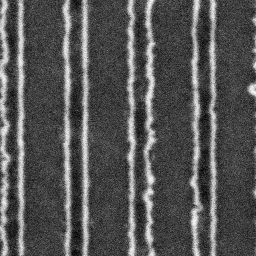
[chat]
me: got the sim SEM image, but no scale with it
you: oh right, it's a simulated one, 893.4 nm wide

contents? one or a few lines or trenches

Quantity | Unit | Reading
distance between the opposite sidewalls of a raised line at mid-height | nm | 65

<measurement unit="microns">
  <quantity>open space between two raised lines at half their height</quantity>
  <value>0.158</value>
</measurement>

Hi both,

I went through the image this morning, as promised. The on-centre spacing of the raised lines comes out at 224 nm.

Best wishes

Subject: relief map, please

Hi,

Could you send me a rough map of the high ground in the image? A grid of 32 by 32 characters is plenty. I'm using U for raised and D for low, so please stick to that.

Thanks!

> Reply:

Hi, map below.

UUUDDDDDUUUDDDDDUUUDDDDDDUUDDDDD
UUUDDDDDUUUDDDDDUUUDDDDDUUUDDDDD
UUUDDDDDUUUDDDDDUUUDDDDDUUUDDDDD
UUUDDDDDUUUDDDDDUUUDDDDDUUUDDDDD
UUUDDDDDUUUDDDDDUUUDDDDDUUUDDDDD
UUUDDDDDUUUDDDDDUUUDDDDDUUUDDDDD
DUUDDDDDUUUDDDDDUUUDDDDDUUUDDDDD
UUUDDDDDUUUDDDDDUUUDDDDDUUUDDDDD
UUUDDDDDUUUDDDDDUUUDDDDDUUUDDDDD
UUUDDDDDUUUDDDDDUUUDDDDDUUUDDDDD
DUUDDDDDUUUDDDDDUUUDDDDDUUUDDDDD
UUUDDDDDUUUDDDDDUUUDDDDDUUUDDDDD
UUUDDDDDUUUDDDDDUUUDDDDDUUUDDDDD
UUUDDDDDUUUDDDDDDUUDDDDDDUUDDDDD
UUUDDDDDUUUDDDDDUUUDDDDDDUUDDDDD
DUUDDDDDUUUDDDDDUUUDDDDDUUUDDDDD
UUUDDDDDUUUDDDDDUUUDDDDDDUUDDDDD
UUUDDDDDUUUDDDDDUUUDDDDDUUUDDDDD
UUUDDDDDUUUDDDDDUUUDDDDDDUUDDDDD
DUUDDDDDUUUDDDDDUUDDDDDDDUUDDDDD
DUUDDDDDUUUDDDDDUUUDDDDDUUUDDDDD
DUUDDDDDUUUDDDDDUUUDDDDDUUUDDDDD
DUUDDDDDUUUDDDDDUUUDDDDDUUUDDDDD
DUUDDDDDUUUDDDDDUUUDDDDDUUUDDDDD
DUUDDDDDUUUDDDDDUUDDDDDDDUUDDDDD
DUUDDDDDUUUDDDDDUUUDDDDDDUUDDDDD
UUUDDDDDUUUDDDDDUUUDDDDDUUUDDDDD
UUUDDDDDUUUDDDDDUUUDDDDDUUUDDDDD
UUUDDDDDUUUDDDDDUUUDDDDDUUUDDDDD
UUUDDDDDUUUDDDDDUUUDDDDDUUUDDDDD
DUUDDDDDUUUDDDDDUUUDDDDDUUUDDDDD
DUUDDDDDUUUDDDDDUUUDDDDDUUUDDDDD